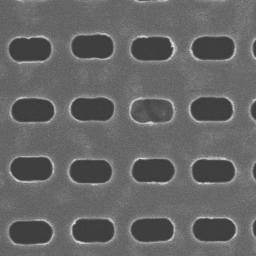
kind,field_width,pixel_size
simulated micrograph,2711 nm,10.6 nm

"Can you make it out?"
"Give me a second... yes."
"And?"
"a regular array of holes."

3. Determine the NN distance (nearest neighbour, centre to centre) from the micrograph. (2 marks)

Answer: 627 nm